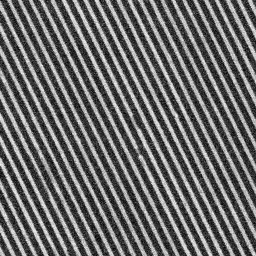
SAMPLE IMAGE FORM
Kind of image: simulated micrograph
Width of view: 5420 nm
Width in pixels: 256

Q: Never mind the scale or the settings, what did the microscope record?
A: parallel lines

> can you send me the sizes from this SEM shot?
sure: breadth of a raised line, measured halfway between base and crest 47.5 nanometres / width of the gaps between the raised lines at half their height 159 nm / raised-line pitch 208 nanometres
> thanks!